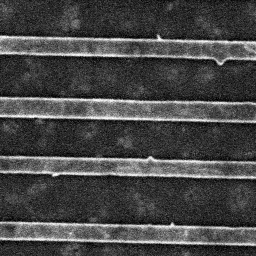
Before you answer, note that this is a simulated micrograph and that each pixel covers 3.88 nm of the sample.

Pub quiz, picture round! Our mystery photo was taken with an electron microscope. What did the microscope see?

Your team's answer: one or a few lines or trenches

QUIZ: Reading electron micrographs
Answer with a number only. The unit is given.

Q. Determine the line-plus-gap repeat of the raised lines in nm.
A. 240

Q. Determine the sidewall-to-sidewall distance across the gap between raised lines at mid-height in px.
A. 43.8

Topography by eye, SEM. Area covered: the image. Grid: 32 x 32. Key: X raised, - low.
--------------------------------
--------------------------------
--------------------------------
--------------------------------
--------------------------------
XXXXXXXXXXXXXXXXXXXXXXXXXXXXXXXX
XXXXXXXXXXXXXXXXXXXXXXXXXXXXXXXX
---------------------------X----
--------------------------------
--------------------------------
--------------------------------
--------------------------------
XXXXXXXXXXXXXX------------------
XXXXXXXXXXXXXXXXXXXXXXXXXXXXXXXX
-XXXXXXXXXXXXXXXXXXXXXXXXXXXXXXX
--------------------------------
--------------------------------
--------------------------------
--------------------------------
--------------------------------
XXXXXXXXXXXXXXXXXXXXXXXXXXXXXXXX
XXXXXXXXXXXXXXXXXXXXXXXXXXXXXXXX
--------------------------------
--------------------------------
--------------------------------
--------------------------------
--------------------------------
--------------------------------
XXXXXXXXXXXXXXXXXXXXXXXXXXXX----
XXXXXXXXXXXXXXXXXXXXXXXXXXXXXXXX
-------------------------XXXXXXX
--------------------------------